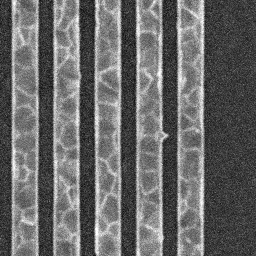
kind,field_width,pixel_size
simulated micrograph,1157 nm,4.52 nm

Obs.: parallel lines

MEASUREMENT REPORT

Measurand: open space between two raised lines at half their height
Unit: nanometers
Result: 76.3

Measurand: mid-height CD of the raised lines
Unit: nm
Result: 110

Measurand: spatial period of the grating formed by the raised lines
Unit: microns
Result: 0.187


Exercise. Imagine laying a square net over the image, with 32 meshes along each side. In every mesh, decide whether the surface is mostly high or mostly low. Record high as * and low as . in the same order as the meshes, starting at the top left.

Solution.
..***..***..***..***..***.......
..***..***..***..***..***.......
..***..***..***..***..***.......
..***..***..***..***..***.......
..***..***..***..***..***.......
..***..***..***..***..***.......
..***..***..***..***..***.......
..***..***..***..***..***.......
..***..***..***..***..***.......
..***..***..***..***..***.......
..***..***..***..***..***.......
..***..***..***..***..***.......
..***..***..***..***..***.......
..***..***..***..***..***.......
..***..***..***..***..***.......
..***..***..***..***..***.......
..***..***..***..***..***.......
..***..***..***..***..***.......
..***..***..***..***..***.......
..***..***..***..***..***.......
..***..***..***..***..***.......
..***..***..***..***..***.......
..***..***..***..***..***.......
..***..***..***..***..***.......
..***..***..***..***..***.......
..***..***..***..***..***.......
..***..***..***..***..***.......
..***..***..***..***..***.......
..***..***..***..***..***.......
..***..***..***..***..***.......
..***..***..***..***..***.......
..***..***..***..***..***.......